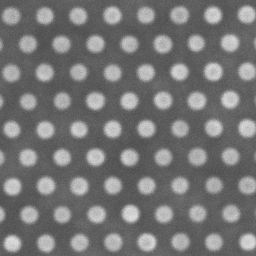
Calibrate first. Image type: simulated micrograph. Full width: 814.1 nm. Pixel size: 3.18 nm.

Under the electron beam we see a regular array of raised bodies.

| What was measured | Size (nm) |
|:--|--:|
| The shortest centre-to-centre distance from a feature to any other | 104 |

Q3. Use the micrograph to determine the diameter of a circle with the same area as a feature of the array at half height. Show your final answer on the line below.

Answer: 50.4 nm